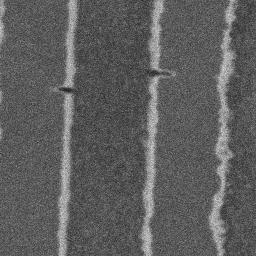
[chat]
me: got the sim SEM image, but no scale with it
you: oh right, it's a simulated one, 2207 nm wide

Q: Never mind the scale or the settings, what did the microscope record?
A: one or a few lines or trenches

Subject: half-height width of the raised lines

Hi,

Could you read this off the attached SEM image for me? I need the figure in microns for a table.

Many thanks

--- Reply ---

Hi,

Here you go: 0.628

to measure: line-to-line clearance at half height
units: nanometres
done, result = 720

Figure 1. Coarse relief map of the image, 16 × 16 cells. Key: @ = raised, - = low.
@@@@@-----@@@@@-
@@@@@-----@@@@--
@@@@------@@@@--
@@@@------@@@@--
@@@@------@@@@--
@@@@------@@@@--
@@@@------@@@@--
@@@@-----@@@@@--
@@@@------@@@@--
@@@@-----@@@@@--
@@@@-----@@@@@--
@@@@-----@@@@@--
@@@@-----@@@@@--
@@@@-----@@@@@--
@@@@-----@@@@@--
@@@@-----@@@@@--